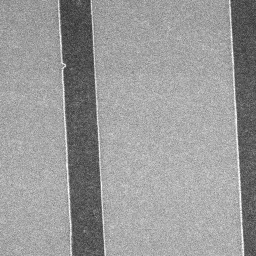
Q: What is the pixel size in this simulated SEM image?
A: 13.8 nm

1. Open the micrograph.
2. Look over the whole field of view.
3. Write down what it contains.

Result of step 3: one or a few lines or trenches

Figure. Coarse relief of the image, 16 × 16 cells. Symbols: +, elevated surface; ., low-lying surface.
....++........++
....++........++
....++........++
....++.........+
....++.........+
....++.........+
....++.........+
....++.........+
....++.........+
....++.........+
....++.........+
....++.........+
....++.........+
....++.........+
....++.........+
....+++........+